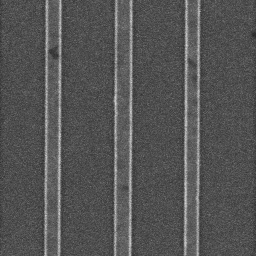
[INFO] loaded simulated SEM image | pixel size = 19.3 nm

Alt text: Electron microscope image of one or a few lines or trenches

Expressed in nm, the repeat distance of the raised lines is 1340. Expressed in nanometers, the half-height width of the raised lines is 268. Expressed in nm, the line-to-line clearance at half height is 1060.